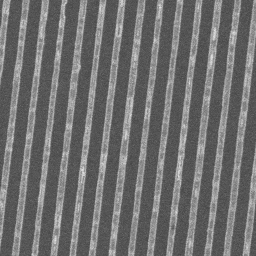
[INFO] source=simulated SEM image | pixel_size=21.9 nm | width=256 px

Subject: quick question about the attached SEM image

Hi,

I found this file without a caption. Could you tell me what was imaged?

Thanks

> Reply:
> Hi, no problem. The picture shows parallel lines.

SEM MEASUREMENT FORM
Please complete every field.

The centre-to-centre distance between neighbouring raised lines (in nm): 418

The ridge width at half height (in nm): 138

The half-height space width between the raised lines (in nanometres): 282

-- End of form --